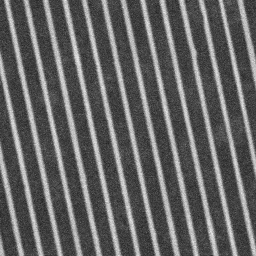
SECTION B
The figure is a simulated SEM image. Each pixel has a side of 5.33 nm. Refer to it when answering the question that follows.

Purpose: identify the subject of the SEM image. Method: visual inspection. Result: parallel lines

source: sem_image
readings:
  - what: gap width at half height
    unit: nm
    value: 79.5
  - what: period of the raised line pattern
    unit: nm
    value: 102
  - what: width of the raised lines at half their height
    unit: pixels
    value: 4.03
